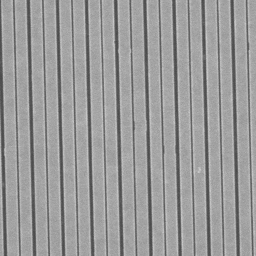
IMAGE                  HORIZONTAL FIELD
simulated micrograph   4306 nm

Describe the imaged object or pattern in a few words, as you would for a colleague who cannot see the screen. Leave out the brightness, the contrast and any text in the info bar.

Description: parallel lines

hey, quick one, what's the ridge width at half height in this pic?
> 187 nanometres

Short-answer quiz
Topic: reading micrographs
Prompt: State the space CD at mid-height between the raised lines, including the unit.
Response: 42 nm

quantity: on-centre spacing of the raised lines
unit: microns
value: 0.245